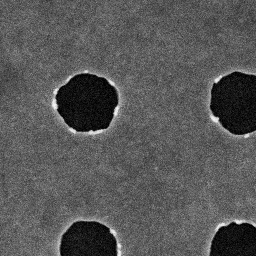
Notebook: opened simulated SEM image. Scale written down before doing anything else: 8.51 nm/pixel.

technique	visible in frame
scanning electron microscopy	holes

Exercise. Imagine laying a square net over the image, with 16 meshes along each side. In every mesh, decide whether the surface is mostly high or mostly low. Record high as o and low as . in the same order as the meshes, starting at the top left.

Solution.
oooooooooooooooo
oooooooooooooooo
oooooooooooooooo
oooooooooooooooo
oooooooooooooooo
oooo...oooooo...
oooo...oooooo...
oooo...ooooooo..
oooooooooooooooo
oooooooooooooooo
oooooooooooooooo
oooooooooooooooo
oooooooooooooooo
oooooooooooooooo
oooo...ooooooo..
oooo...oooooo...